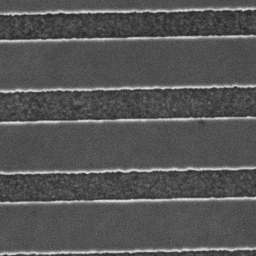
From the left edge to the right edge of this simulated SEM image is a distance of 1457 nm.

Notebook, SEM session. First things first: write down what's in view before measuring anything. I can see lines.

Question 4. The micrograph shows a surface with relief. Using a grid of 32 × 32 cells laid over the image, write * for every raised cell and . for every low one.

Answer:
********************************
******************.**...........
................................
................................
...............................*
********************************
********************************
********************************
********************************
********************************
********************************
**..............................
................................
................................
................................
********************************
********************************
********************************
********************************
********************************
********************************
*************..*................
................................
................................
................................
********************************
********************************
********************************
********************************
********************************
********************************
*****************...............